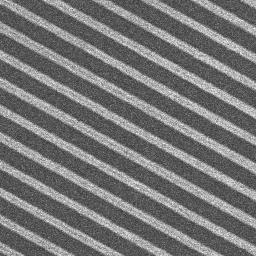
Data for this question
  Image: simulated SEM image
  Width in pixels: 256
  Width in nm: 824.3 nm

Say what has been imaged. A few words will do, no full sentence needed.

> parallel lines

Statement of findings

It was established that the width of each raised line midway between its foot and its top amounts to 21.8 nanometres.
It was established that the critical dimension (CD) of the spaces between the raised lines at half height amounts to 17.5 pixels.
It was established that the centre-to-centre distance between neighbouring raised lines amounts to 24 pixels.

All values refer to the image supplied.